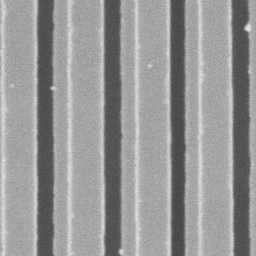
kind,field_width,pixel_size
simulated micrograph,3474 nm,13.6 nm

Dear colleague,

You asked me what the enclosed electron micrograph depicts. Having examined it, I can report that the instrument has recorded lines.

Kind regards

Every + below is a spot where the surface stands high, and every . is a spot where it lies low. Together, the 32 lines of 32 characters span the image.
+++++..++++++..++++++..++++++..+
+++++..++++++..++++++..++++++..+
++++...++++++..++++++..++++++..+
++++...++++++..++++++..++++++..+
+++++..++++++..++++++..++++++..+
+++++..++++++..++++++..++++++..+
+++++..++++++..++++++..++++++..+
+++++..++++++..++++++..++++++..+
+++++..++++++..++++++..++++++..+
+++++..++++++..++++++..++++++..+
+++++..++++++..++++++..++++++..+
+++++..++++++..++++++..++++++..+
+++++..++++++..++++++..++++++..+
+++++..++++++..++++++..++++++..+
+++++..++++++..++++++..++++++..+
+++++..++++++..++++++..++++++..+
+++++..++++++..++++++..++++++..+
+++++..++++++..++++++..++++++..+
+++++..++++++..++++++..++++++..+
+++++..++++++..++++++..++++++..+
++++...++++++..++++++..++++++..+
+++++..++++++..++++++..++++++..+
+++++..++++++..++++++..++++++..+
+++++..++++++..++++++..++++++..+
+++++..++++++..++++++..++++++..+
+++++..++++++..++++++..++++++..+
+++++..++++++..++++++..++++++..+
+++++..++++++..++++++..++++++..+
+++++..++++++..++++++..++++++..+
+++++..++++++..++++++..++++++..+
+++++..++++++..++++++..++++++..+
++++...++++++..++++++..++++++..+